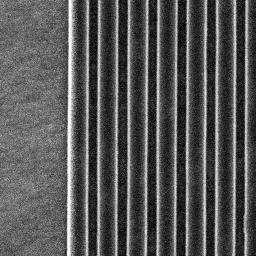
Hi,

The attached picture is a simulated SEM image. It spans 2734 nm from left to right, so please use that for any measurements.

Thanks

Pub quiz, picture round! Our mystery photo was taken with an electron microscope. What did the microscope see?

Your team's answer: parallel lines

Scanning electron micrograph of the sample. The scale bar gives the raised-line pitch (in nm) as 315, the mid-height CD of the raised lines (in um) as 0.198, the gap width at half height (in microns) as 0.114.